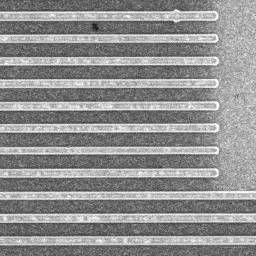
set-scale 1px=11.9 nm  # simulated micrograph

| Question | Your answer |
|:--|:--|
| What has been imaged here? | parallel lines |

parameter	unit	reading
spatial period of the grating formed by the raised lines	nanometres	269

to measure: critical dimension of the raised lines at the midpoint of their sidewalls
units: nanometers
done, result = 92.5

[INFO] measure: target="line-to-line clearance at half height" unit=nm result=172